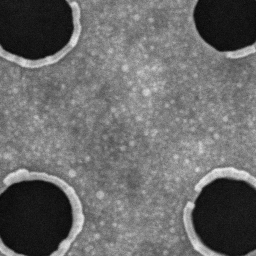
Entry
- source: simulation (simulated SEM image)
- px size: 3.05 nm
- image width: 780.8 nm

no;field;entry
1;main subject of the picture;holes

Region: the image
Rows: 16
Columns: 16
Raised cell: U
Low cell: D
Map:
DDDDUUUUUUUUDDDD
DDDDDUUUUUUUDDDD
DDDDUUUUUUUUUDDD
UDDUUUUUUUUUUUUU
UUUUUUUUUUUUUUUU
UUUUUUUUUUUUUUUU
UUUUUUUUUUUUUUUU
UUUUUUUUUUUUUUUU
UUUUUUUUUUUUUUUU
UUUUUUUUUUUUUUUU
UUUUUUUUUUUUUUUU
UDDUUUUUUUUUUDDD
DDDDUUUUUUUUDDDD
DDDDDUUUUUUUDDDD
DDDDUUUUUUUUDDDD
UDDDUUUUUUUUUDDD